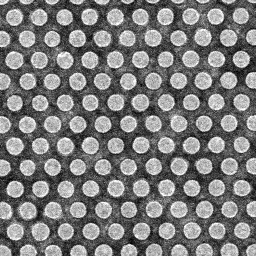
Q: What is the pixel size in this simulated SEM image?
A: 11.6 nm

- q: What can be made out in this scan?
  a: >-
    a regular array of raised bodies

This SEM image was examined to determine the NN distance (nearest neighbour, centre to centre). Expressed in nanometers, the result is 285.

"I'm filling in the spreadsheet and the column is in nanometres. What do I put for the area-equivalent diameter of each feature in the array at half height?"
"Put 184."